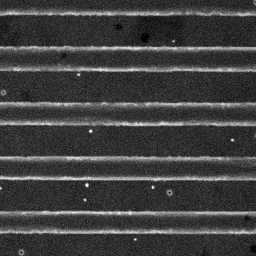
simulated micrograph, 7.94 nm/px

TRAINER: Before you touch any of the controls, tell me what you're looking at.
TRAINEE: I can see lines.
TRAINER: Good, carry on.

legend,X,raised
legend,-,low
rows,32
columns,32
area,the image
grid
XXXXXXXXXXXXXXXXXXXXXXXXXXXXXXXX
XXXXXXXXXXXXXXXXXXXXXXXXXXXXXXXX
--------------------------------
--------------------------------
--------------------------------
--------------------------------
XXXXXXXXXXXXXXXXXXXXXXXXXXXXXXXX
XXXXXXXXXXXXXXXXXXXXXXXXXXXXXXXX
XXXXXXXXXXXXXXXXXXXXXXXXXXXXXXXX
--------------------------------
--------------------------------
--------------------------------
--------------------------------
XXXXXXXXXXXXXXXXXXXXXXXXXXXXXXXX
XXXXXXXXXXXXXXXXXXXXXXXXXXXXXXXX
---------------XXXXXXXX-------X-
--------------------------------
--------------------------------
--------------------------------
--------------------------------
XXXXXXXXXXXXXXXXXXXXXXXXXXXXXXXX
XXXXXXXXXXXXXXXXXXXXXXXXXXXXXXXX
--------------------------------
--------------------------------
--------------------------------
--------------------------------
--------------------------------
XXXXXXXXXXXXXXXXXXXXXXXXXXXXXXXX
XXXXXXXXXXXXXXXXXXXXXXXXXXXXXXXX
--------------------------------
--------------------------------
--------------------------------